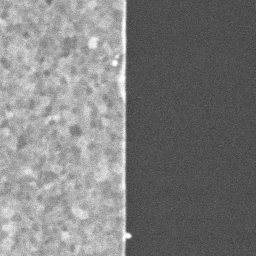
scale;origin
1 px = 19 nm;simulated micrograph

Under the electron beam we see wiring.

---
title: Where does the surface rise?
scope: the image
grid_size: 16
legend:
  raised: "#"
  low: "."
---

########........
########........
########........
########........
########........
########........
########........
########........
########........
########........
########........
########........
########........
########........
########........
########........